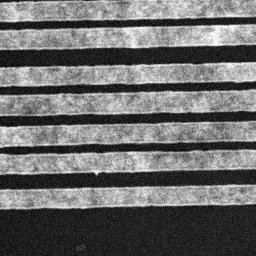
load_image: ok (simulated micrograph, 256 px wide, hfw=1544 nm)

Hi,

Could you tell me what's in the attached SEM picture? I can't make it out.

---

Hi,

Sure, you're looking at parallel lines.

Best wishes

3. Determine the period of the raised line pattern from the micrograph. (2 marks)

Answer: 190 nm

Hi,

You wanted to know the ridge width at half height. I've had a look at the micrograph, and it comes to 111 nm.